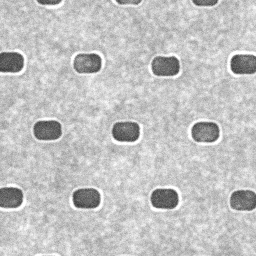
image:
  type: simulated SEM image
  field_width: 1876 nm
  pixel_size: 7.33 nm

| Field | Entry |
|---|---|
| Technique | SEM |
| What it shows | holes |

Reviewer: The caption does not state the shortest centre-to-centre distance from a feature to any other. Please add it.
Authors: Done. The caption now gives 567 nm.